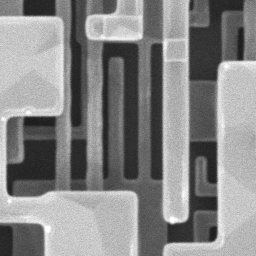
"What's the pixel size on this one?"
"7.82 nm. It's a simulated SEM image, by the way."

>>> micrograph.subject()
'wiring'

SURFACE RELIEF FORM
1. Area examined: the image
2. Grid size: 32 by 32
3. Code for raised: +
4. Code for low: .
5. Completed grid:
+++....++..++..+++..++++.......+
+++....++..++.++++..+++........+
+++++++++..+++++++..+++........+
+++++++++..+++++++..+++........+
+++++++++..+++++++..+++........+
+++++++++..++.......+++........+
+++++++++..++.......+++........+
+++++++++..++.......+++.......++
+++++++++..++.......+++....+++++
+++++++++..++.......+++....+++++
+++++++++..++.......+++....+++++
+++++++++..++.......++++...+++++
+++++++++..++.......++++...+++++
+++++++++..++.......++++...+++++
+++....++..++.......++++...+++++
+++....++..++.......++++...+++++
+++....++..++.......++++...+++++
+++....++..++.......++++...+++++
+++....++..++.......++++...+++++
+++....++..++.......++++...+++++
+......++..++.......++++...+++++
+......++..++.......+++....+++++
+......++..++.......+++....+++++
+......++..++.......+++....+++++
+....++++++++++++...+++....+++++
+++++++++++++++++...+++....+++++
+++++++++++++++++...+++....+++++
+++++++++++++++++....++....+++++
.....++++++++++++..........+++++
......+++++++++++..........+++++
......+++++++++++....+++++++++++
......+++++++++++...++++++++++++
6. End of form